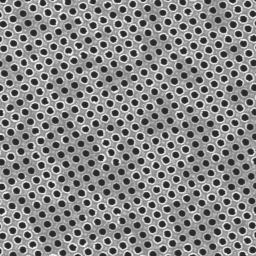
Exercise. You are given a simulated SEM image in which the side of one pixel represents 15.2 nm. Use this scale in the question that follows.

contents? a regular array of holes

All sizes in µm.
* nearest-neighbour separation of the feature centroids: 0.164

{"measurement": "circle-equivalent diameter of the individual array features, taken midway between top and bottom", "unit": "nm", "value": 107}